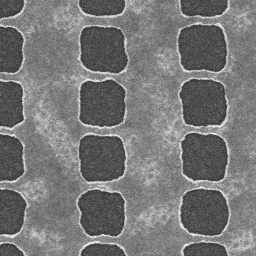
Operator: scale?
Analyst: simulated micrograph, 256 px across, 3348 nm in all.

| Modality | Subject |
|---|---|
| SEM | a regular array of holes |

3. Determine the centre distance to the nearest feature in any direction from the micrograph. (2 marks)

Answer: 54.4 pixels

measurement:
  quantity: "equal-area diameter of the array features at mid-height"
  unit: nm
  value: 655